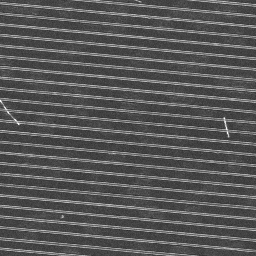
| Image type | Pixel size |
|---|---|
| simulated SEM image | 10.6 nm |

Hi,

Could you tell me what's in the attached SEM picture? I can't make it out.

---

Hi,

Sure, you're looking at parallel lines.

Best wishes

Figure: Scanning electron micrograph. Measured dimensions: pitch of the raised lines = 0.113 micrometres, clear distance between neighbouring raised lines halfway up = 87.4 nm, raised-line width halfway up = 0.0251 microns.